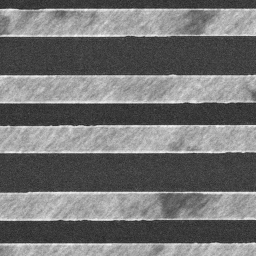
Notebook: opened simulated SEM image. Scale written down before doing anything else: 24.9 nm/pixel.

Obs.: lines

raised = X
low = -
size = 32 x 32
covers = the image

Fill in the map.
--------------------------------
XXXXXXXXXXXXXXXXXXXXXXXXXXXXXXXX
XXXXXXXXXXXXXXXXXXXXXXXXXXXXXXXX
XXXXXXXXXXXXXXXXXXXXXXXXXXXXXXXX
XXXXXXXXXXXXXXXX----X-----------
--------------------------------
--------------------------------
--------------------------------
--------------------------------
--------------------------------
XXXXXXXXXXXXXXXXXXXXXXXXXXXXXXXX
XXXXXXXXXXXXXXXXXXXXXXXXXXXXXXXX
XXXXXXXXXXXXXXXXXXXXXXXXXXXXXXXX
--------------------------------
--------------------------------
--------------------------------
XXXXXXXXXXXXXXXXXXXXXXXXXXXXXXXX
XXXXXXXXXXXXXXXXXXXXXXXXXXXXXXXX
XXXXXXXXXXXXXXXXXXXXXXXXXXXXXXXX
--------------------------------
--------------------------------
--------------------------------
--------------------------------
--------------------------------
XXXXXXXXXXXXXXXXXXXXXXXXXXXXXXXX
XXXXXXXXXXXXXXXXXXXXXXXXXXXXXXXX
XXXXXXXXXXXXXXXXXXXXXXXXXXXXXXXX
XXXXXXX--X-XXXXXXXX-------------
--------------------------------
--------------------------------
-------------------------------X
XXXXXXXXXXXXXXXXXXXXXXXXXXXXXXXX